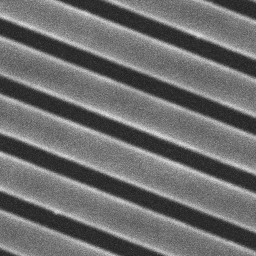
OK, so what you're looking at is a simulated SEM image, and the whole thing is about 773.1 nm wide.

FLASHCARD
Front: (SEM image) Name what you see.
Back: parallel lines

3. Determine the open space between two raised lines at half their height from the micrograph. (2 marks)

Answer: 57.4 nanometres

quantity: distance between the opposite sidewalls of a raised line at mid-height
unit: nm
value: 107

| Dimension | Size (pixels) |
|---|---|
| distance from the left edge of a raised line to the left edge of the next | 53.8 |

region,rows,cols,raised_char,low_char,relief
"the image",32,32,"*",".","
********......*************.....
***********......************...
.************......*************
....************......**********
......************.......*******
**.......************......*****
*****......************.......**
********......************......
**********......*************...
.************......************.
...************.......**********
......************......********
**......************.......*****
****.......************......***
*******......************.......
*********.......************....
************......*************.
...***********.......***********
.....************.......********
*.......************......******
****......************.......***
******.......************......*
*********......************.....
***********.......************..
..************.......***********
....*************......*********
*......************.......******
***.......************......****
******......************.......*
********.......************.....
***********......************...
.************.......************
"